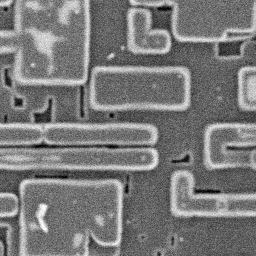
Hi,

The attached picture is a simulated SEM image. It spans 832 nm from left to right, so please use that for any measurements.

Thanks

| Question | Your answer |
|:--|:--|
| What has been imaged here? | wiring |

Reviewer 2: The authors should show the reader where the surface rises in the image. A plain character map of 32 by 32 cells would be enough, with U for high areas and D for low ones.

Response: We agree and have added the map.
UDUUUUUUUUUDDDDDDUUUDUUUUUUUUUUU
DDUUUUUUUUUDDDDDUUDDDDUUUUUUUUUU
DDUUUUUUUUUDDDDDUUUDDDUUUUUUUUUU
DDUUUUUUUUUDDDDDUUUDDDUUUUUUUUUU
UUUUUUUUUUUDDDDDUUUUUDUUUUUUDDDD
UUUUUUUUUUUDDDDDUUUUUDDDDDDDDDDD
DDUUUUUUUUUDDDDDDDDUDDDDDDDDDDDD
DDUUUUUUUUUDDDDDDDDDDDDDDDDDDDDD
DDUUUUUUUUUDDDDDDDDDDDDDDDDDDDDD
DDUUUUUUUUUUUUUUUUUUUUUUDDDDDDUU
DDDDDDDDDDDUUUUUUUUUUUUUDDDDDDUU
DDDDDDDDDDDUUUUUUUUUUUUUDDDDDDUU
DDDDDDDDDDDUUUUUUUUUUUUUDDDDDDUU
DDDDDDDDDDDDUUUUDDDDDDDDDDDDDDDU
DDDDDDDDDDDDDDDDDDDDDDDDDDDDDDDD
DDDDDDDDDDDDDDDDDDDDDDDDDDDDDDDD
UUUUUUUUUUUUUUUUUUUDDDDDDDUUUUUU
UUUUUUUUUUUUUUUUUUUDDDDDDDUUUUUU
UUUDDDDUUUUUUUUUUUUDDDDDDDUUDDDD
UUUUUUUUUUUUUUUUUUUDDDDDDDUUUUDU
UUUUUUUUUUUUUUUUUUUDDDDDDDUUUDDD
DDDDDDDDDDDDDDDDDDDDDDDDDDDDDDDD
DDDDDDDDDDDDDDDDDDDDDDUUDDDDDDDD
DDDUUUUUUUUUUUUDDDDDDDUUDDDDDDDD
UUDUUUUUUUUUUUUDDDDDDDUUUUUDDDDD
UUUUUUUUUUUUUUUDDDDDDDUUUUUDUUUU
UUUUUUUUUUUUUUUDDDDDDDUUUUUUUUUU
DDDUUUUUUUUUUUUDDDDDDDDDDDDDDDDD
DDDUUUUUUUUUUUUDDDDDDDDDDDDDDDDD
DDDUUUUUUUUUUUUDDDDDDDDDDDDDDDDD
DDDUUUUUUUUDDUDDDDDDDDDDDDDDDDDD
DDDUUUUUUUUDDDDDDDDDDDDDDDDDDDDD